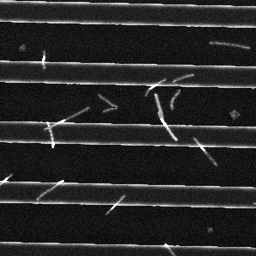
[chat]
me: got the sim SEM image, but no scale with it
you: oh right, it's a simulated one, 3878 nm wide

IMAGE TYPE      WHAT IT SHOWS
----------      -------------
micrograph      lines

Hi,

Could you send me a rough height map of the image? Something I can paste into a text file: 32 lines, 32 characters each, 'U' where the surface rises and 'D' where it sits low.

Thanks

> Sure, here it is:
UUUUUUUUUUUUUUUUDDDDDDDDDDDDDDDD
UUUUUUUUUUUUUUUUUUUUUUUUUUUUUUUU
UUUUUUUUUUUUUUUUUUUUUUUUUUUUUUUU
DDDDDDDDDDDDDDDDDDDDDDDDDDDDDDDD
DDDDDDDDDDDDDDDDDDDDDDDDDDDDDDDD
DDDDDDDDDDDDDDDDDDDDDDDDDDDDDDDD
DDDDDDDDDDDDDDDDDDDDDDDDDDDDDDDD
DDDDDDDDDDDDDDDDDDDDDDDDDDDDDDDD
UUUUUUUUUUUUUUUUUUUUUUUUUUUUUUUU
UUUUUUUUUUUUUUUUUUUUUUUUUUUUUUUU
DDDDDDDDDDDDDDUUUUUUUUUUUUUUUUUU
DDDDDDDDDDDDDDDDDDDDDDDDDDDDDDDD
DDDDDDDDDDDDDDDDDDDDDDDDDDDDDDDD
DDDDDDDDDDDDDDDDDDDDDDDDDDDDDDDD
DDDDDDDDDDDDDDDDDDDDDDDDDDDDDDDD
UUUUUUUUUUUUUUDDDDDDUDDDDDDDDDDD
UUUUUUUUUUUUUUUUUUUUUUUUUUUUUUUU
UUUUUUUUUUUUUUUUUUUUUUUUUUUUUUUU
DDDDDDDDDDDDDDDDDDDDDDDDDDDDDDDD
DDDDDDDDDDDDDDDDDDDDDDDDDDDDDDDD
DDDDDDDDDDDDDDDDDDDDDDDDDDDDDDDD
DDDDDDDDDDDDDDDDDDDDDDDDDDDDDDDD
DDDDDDDDDDDDDDDDDDDDDDDDDDDDDDDD
UUUUUUUUUUUUUUUUUUUUUUUUUUUUUUUU
UUUUUUUUUUUUUUUUUUUUUUUUUUUUUUUU
DDDDDDDDDDUUUUUUUUUUUUUUUUUUUUUU
DDDDDDDDDDDDDDDDDDDDDDDDDDDDDDDD
DDDDDDDDDDDDDDDDDDDDDDDDDDDDDDDD
DDDDDDDDDDDDDDDDDDDDDDDDDDDDDDDD
DDDDDDDDDDDDDDDDDDDDDDDDDDDDDDDD
UUUUUUUDDDDDDDDDDDDDDDDDDDDDDDDD
UUUUUUUUUUUUUUUUUUUUUUUUUUUUUUUU